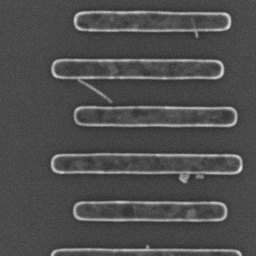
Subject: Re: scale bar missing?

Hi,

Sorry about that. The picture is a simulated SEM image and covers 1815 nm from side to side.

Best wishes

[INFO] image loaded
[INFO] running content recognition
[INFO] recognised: groups of lines, slits or small figures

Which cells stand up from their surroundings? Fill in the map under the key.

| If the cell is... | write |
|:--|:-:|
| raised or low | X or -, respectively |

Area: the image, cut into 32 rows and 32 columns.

--------------------------------
------------XX---XX-------------
---------XXXXXXXXXXXXXXXXXXXX---
----------XXXXXXXXXXXXXXXXXX----
--------------------------------
--------------------------------
--------------------------------
--------------------------------
-------XXXXXXXXXXXXXXXXXXXXX----
-------XXXXXXXXXXXXXXXXXXXX-----
--------------------------------
--------------------------------
--------------------------------
----------XXX--XXXXXX-----------
---------XXXXXXXXXXXXXXXXXXXXX--
----------XXXXXXXXXXXXXXXXXXX---
--------------------------------
--------------------------------
--------------------------------
-------XXXXXXXXXXXXXXXXXX-------
-------XXXXXXXXXXXXXXXXXXXXXXX--
-------XXX-XXXXXXXXXXXXXXXXXXX--
--------------------------------
--------------------------------
--------------------------------
----------XXXXXXXXXXXXXXXXXX----
---------XXXXXXXXXXXXXXXXXXX----
-------------XXXX-XXXXXXXXX-----
--------------------------------
--------------------------------
--------------------------------
-------XXXXXXXXXXXXXXXXXXXXXXX--